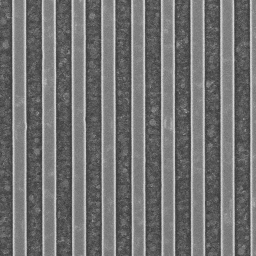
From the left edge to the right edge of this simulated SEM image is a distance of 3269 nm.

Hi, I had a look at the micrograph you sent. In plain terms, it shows parallel lines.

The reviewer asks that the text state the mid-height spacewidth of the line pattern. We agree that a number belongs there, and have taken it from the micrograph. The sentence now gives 216 nm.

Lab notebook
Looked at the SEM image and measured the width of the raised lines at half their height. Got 158 nm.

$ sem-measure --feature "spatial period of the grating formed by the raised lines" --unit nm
380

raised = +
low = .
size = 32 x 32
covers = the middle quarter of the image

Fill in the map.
..+++.....+++....+++....++++....
..+++.....+++....+++....++++....
..+++.....+++....+++....++++....
..+++.....+++....+++....++++....
..+++.....+++....+++....++++....
..+++.....+++....+++....++++....
..+++.....+++....+++.....+++....
..+++.....+++....+++.....+++....
..+++.....+++....+++.....+++....
..+++.....+++....+++.....+++....
..+++.....+++....+++.....+++....
..+++.....+++....+++..+..+++....
..+++.....+++....+++.....+++....
..+++..+..+++....+++.....+++....
..+++.....+++....+++..+..+++....
..+++.....+++....+++.....+++....
..+++.....+++....+++.....+++....
..+++.....+++....+++.....+++....
..+++.....+++....+++.....+++....
..+++.....+++....+++.....+++....
..+++.....+++....+++.....+++....
..+++.....+++....+++.....+++....
..+++.....+++....+++.....+++....
..+++.....+++....+++.....+++....
..+++.....+++....+++.....+++....
..+++.....+++....+++.....+++....
..+++.....+++....+++.....+++....
..+++.....+++....+++.....+++....
..+++.....+++....+++.....+++....
+.+++.....+++....+++.....+++....
+.+++.....+++....+++.....+++....
..+++.....+++....+++.....+++....